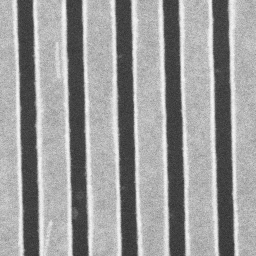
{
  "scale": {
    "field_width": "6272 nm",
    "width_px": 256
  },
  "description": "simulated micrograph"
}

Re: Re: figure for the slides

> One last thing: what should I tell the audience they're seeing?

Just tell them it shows lines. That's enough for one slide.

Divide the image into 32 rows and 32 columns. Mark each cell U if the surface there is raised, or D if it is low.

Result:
UUDDUUUUDDUUUUDDUUUUDDUUUUDDDUUU
UUDDUUUUDDUUUUDDUUUUDDUUUUDDDUUU
UUDDUUUUDDUUUUDDUUUUDDDUUUUDDUUU
UUDDUUUUDDUUUUDDDUUUDDDUUUUDDUUU
UUDDUUUUDDUUUUDDDUUUDDDUUUUDDUUU
UUDDUUUUDDUUUUDDDUUUUDDUUUUDDUUU
UUDDUUUUDDUUUUDDDUUUUDDUUUUDDUUU
UUDDUUUUDDUUUUDDDUUUUDDUUUUDDUUU
UUDDUUUUDDDUUUUDDUUUUDDUUUUDDUUU
UUDDUUUUDDDUUUUDDUUUUDDUUUUDDUUU
UUDDUUUUDDDUUUUDDUUUUDDUUUUDDUUU
UUDDDUUUDDDUUUUDDUUUUDDUUUUDDUUU
UUDDDUUUUDDUUUUDDUUUUDDUUUUDDUUU
UUDDDUUUUDDUUUUDDUUUUDDUUUUDDUUU
UUDDDUUUUDDUUUUDDUUUUDDUUUUDDUUU
UUDDDUUUUDDUUUUDDUUUUDDUUUUDDUUU
UUDDDUUUUDDUUUUDDUUUUDDUUUUDDUUU
UUDDDUUUUDDUUUUDDUUUUDDUUUUDDUUU
UUUDDUUUUDDUUUUDDUUUUDDUUUUDDUUU
UUUDDUUUUDDUUUUDDUUUUDDUUUUDDUUU
UUUDDUUUUDDUUUUDDUUUUDDUUUUDDUUU
UUUDDUUUUDDUUUUDDUUUUDDUUUUDDUUU
UUUDDUUUUDDUUUUDDUUUUDDUUUUDDUUU
UUUDDUUUUDDUUUUDDUUUUDDUUUUDDUUU
UUUDDUUUUDDUUUUDDUUUUDDUUUUDDUUU
UUUDDUUUUDDUUUUDDUUUUDDUUUUDDUUU
UUUDDUUUUDDUUUUDDUUUUDDUUUUDDUUU
UUUDDUUUUDDUUUUDDUUUUDDUUUUDDUUU
UUUDDUUUUDDUUUUDDUUUUDDUUUUDDUUU
UUUDDUUUUDDUUUUDDUUUUDDUUUUDDUUU
UUUDDUUUUDDUUUUDDUUUUDDUUUUDDUUU
UUUDDUUUUDDUUUUDDUUUUDDUUUUDDUUU